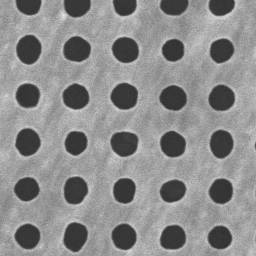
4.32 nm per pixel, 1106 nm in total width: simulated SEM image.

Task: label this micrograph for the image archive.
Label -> a regular array of holes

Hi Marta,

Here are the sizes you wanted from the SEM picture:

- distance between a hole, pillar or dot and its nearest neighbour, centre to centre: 201 nanometers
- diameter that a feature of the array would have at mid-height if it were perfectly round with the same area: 25.5 pixels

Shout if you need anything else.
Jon